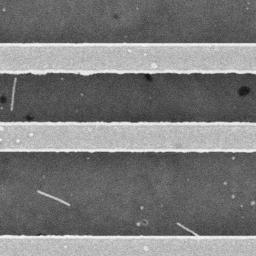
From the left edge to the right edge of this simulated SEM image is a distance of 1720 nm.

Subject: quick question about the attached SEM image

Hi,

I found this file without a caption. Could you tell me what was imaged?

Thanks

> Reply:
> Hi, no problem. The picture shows lines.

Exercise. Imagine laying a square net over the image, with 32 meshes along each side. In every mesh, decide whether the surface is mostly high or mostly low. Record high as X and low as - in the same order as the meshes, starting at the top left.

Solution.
--------------------------------
--------------------------------
--------------------------------
--------------------------------
--------------------------------
XXXXXXXXX-XXXXXXXXXXXXXXXXXXXXXX
XXXXXXXXXXXXXXXXXXXXXXXXXXXXXXXX
XXXXXXXXXXXXXXXXXXXXXXXXXXXXXXXX
XXXXXXXXXXXXXXXXXXXXXXXXXXXXXXXX
--------------------------------
--------------------------------
--------------------------------
--------------------------------
--------------------------------
--------------------------------
XXXXXXXXXXXXXXXXXXXXXXXXXXXXXXXX
XXXXXXXXXXXXXXXXXXXXXXXXXXXXXXXX
XXXXXXXXXXXXXXXXXXXXXXXXXXXXXXXX
XXXXXXXXXXXXXXXXXXXXXXXXXXXXXXXX
--------------------------------
--------------------------------
--------------------------------
--------------------------------
--------------------------------
--------------------------------
--------------------------------
--------------------------------
--------------------------------
--------------------------------
X-------X-----------------------
XXXXXXXXXXXXXXXXXXXXXXXXXXXXXXXX
XXXXXXXXXXXXXXXXXXXXXXXXXXXXXXXX